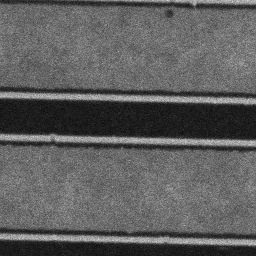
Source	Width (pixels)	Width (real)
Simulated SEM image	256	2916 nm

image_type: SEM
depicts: one or a few lines or trenches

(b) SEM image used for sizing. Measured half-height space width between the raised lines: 1130 nm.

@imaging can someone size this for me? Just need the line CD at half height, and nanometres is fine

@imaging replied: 485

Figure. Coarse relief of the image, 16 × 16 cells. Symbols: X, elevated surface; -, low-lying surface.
----------------
----------------
----------------
----------------
----------------
----------------
XXXXXXXXXXXXXXXX
XXXXXXXXXXXXXXXX
XXXXXXXXXXXXXXXX
----------------
----------------
----------------
----------------
----------------
----------------
XXXXXXXXXXXXXXXX